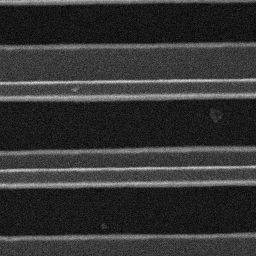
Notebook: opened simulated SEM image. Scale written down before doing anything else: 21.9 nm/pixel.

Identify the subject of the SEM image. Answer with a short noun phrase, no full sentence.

lines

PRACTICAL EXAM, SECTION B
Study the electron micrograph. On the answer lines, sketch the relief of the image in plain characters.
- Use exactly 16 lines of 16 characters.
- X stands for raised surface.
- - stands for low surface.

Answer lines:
----------------
----------------
----------------
XXXXXXXXXXXXXXXX
XXXXXXXXXXXXXXXX
XXXXXXXXXXXXXXXX
----------------
----------------
----------------
-------XXXXXXXXX
XXXXXXXXXXXXXXXX
XXXXXXXX--------
----------------
----------------
----------------
XXXXXXXXXXXXXXXX